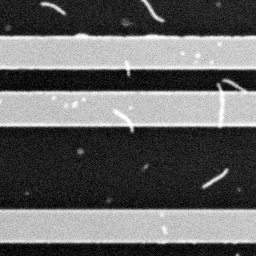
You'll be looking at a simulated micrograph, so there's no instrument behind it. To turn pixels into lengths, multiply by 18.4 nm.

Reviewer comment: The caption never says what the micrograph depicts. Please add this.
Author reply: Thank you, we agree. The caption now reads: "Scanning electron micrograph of lines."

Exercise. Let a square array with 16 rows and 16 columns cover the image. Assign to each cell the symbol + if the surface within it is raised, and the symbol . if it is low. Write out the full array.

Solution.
................
................
++++++++++++++++
++++++++++++++++
................
................
++++++++++++++++
++++++++++++++++
................
................
................
................
................
++++++++++++++++
++++++++++++++++
................